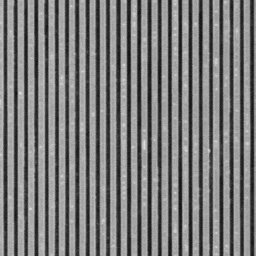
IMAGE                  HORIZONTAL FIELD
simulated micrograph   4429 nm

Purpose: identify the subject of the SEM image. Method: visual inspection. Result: parallel lines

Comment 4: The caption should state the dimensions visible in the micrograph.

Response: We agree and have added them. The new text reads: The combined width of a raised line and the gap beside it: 178 nm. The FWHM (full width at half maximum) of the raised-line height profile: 5.62 px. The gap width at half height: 0.08 µm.